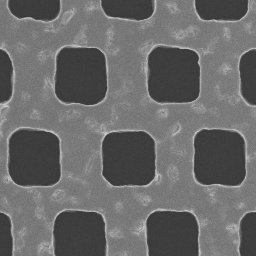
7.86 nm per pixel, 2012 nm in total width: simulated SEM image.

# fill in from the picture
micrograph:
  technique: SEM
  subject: holes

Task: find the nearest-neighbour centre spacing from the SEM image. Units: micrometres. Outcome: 0.728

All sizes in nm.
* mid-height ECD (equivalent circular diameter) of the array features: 460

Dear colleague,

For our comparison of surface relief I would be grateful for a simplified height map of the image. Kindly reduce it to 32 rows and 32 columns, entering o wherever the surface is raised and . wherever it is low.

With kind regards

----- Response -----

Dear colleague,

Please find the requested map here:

o.......ooooo......ooooo.......o
o......oooooo......oooooo......o
ooooo..oooooooooo.ooooooo.....oo
oooooooooooooooooooooooooooooooo
oooooooooooooooooooooooooooooooo
oooooooooooooooooooooooooooooooo
.ooooooo.....oooooo.....ooooooo.
.oooooo......oooooo......ooooo..
..ooooo......ooooo.......ooooo..
..ooooo......oooooo......ooooo..
..ooooo......ooooo.......ooooo..
..ooooo......oooooo......ooooo..
.ooooooo.....oooooo.....ooooooo.
oooooooooooooooooooooooooooooooo
oooooooooooooooooooooooooooooooo
oooooooooooooooooooooooooooooooo
oo....oooooooo....ooooooo....ooo
o......oooooo......ooooo.......o
o......oooooo......ooooo.......o
o......oooooo......ooooo.......o
o.......ooooo......ooooo.......o
o.......ooooo......ooooo.......o
oo.....oooooo......oooooo.....oo
oooooooooooooooooooooooooooooooo
oooooooooooooooooooooooooooooooo
oooooooooooooooooooooooooooooooo
oooooooo....ooooooo.....oooooooo
.oooooo......ooooo.......ooooo..
.oooooo......ooooo.......ooooo..
..ooooo......ooooo.......ooooo..
..ooooo......ooooo.......ooooo..
..ooooo......oooooo......ooooo..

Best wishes